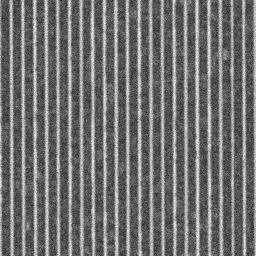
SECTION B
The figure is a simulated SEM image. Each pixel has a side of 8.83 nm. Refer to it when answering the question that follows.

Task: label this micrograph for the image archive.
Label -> parallel lines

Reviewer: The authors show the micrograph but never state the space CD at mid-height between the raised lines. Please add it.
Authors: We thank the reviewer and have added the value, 0.085 µm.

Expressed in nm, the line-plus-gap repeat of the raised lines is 103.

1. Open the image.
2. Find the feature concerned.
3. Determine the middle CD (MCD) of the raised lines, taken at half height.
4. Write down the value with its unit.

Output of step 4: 15.5 nanometers